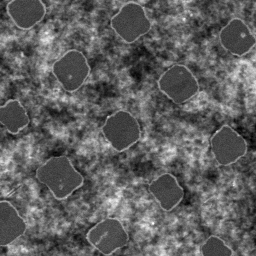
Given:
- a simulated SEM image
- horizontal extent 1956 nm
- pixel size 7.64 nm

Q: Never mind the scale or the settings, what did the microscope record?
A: a regular array of raised bodies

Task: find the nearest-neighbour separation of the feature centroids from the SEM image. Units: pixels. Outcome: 74.9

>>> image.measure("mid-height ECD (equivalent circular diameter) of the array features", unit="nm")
281